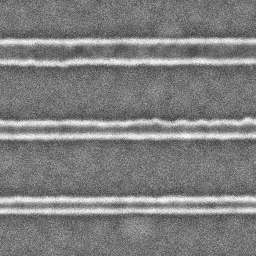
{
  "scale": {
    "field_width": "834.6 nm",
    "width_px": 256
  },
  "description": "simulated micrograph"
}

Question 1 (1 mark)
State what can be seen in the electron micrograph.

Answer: one or a few lines or trenches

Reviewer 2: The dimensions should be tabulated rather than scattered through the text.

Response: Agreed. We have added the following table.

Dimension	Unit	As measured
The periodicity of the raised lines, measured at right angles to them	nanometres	250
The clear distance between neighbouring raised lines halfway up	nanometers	200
